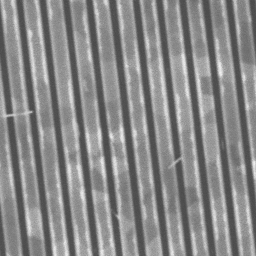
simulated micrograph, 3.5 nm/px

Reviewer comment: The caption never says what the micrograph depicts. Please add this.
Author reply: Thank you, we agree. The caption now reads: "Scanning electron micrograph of parallel lines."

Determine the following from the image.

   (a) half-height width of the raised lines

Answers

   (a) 0.0509 micrometres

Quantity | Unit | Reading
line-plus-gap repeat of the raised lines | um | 0.0809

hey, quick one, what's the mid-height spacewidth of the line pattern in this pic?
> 28.6 nanometers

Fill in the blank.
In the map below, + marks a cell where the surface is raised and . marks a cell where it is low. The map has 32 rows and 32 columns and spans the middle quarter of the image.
+..++++..++++..++++..++++..++++.
+...+++...+++..++++..++++..++++.
+...+++...+++...+++..++++..++++.
++..+++...+++...+++..++++..++++.
++..+++...+++...+++...+++..++++.
++..++++..++++..+++...+++...+++.
++..++++..++++..++++..+++...+++.
++..++++..++++..++++..+++...+++.
++..++++..++++..++++..++++..+++.
++...+++..++++..++++..++++..++++
++...+++...+++...+++..++++..++++
+++..+++...+++...+++..++++..++++
+++..+++...+++...+++..++++..++++
+++..++++..+++...+++...+++...+++
+++..++++..++++..++++..+++...+++
+++..++++..++++..++++..+++...+++
+++..++++..++++..++++..+++...+++
+++..++++..++++..++++..++++..+++
+++...+++...+++..++++..++++..+++
+++...+++...+++..++++..++++..+++
++++..+++...+++..++++..++++..+++
++++..+++...+++...+++...+++..+++
++++..++++..++++..+++...+++...++
++++..++++..++++..++++..+++..+++
.+++..++++..++++..++++..++++..++
.+++..++++..++++..++++..++++..++
.+++...+++..++++..++++..++++..++
.+++...+++...+++...+++..++++..++
.++++..+++...+++...+++..++++..++
.++++..+++...+++...+++..++++..++
.++++..++++..+++...+++...+++..++
.++++..++++..++++..++++..+++...+